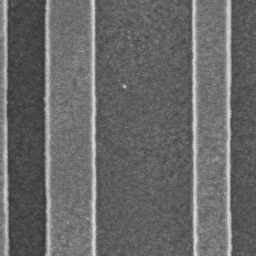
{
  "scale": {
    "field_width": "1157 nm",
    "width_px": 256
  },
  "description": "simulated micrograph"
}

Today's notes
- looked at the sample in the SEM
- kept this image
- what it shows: lines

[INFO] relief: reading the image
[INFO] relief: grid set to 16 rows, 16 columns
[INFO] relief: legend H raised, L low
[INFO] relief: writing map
LLLHHHLLLLLLHHLL
LLLHHHLLLLLLHHLL
LLLHHHLLLLLLHHLL
LLLHHHLLLLLLHHLL
LLLHHHLLLLLLHHLL
LLLHHHLLLLLLHHLL
LLLHHHLLLLLLHHLL
LLLHHHLLLLLLHHLL
LLLHHHLLLLLLHHLL
LLLHHHLLLLLLHHLL
LLLHHHLLLLLLHHLL
LLLHHHLLLLLLHHLL
LLLHHHLLLLLLHHLL
LLLHHHLLLLLLHHLL
LLLHHHLLLLLLHHLL
LLLHHHLLLLLLHHLL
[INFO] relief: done